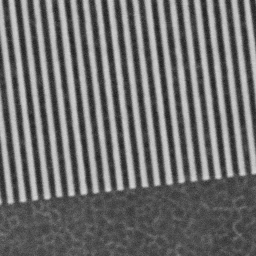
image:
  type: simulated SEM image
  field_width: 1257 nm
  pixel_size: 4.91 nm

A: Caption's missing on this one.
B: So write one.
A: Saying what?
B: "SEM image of parallel lines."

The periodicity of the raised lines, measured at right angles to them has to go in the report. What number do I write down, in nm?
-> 60.4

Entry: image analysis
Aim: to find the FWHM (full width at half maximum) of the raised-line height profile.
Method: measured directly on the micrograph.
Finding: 25.6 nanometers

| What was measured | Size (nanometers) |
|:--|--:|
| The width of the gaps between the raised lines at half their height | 34.1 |